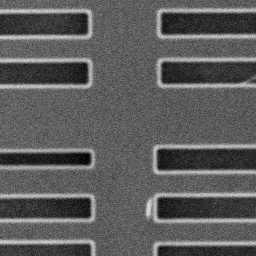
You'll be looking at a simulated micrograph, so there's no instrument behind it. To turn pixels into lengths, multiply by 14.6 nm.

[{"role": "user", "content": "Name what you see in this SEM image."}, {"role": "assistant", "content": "groups of lines, slits or small figures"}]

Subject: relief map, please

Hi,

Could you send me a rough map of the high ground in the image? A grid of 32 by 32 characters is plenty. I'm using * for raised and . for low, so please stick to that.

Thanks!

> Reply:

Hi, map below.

********************************
...........*********............
...........*********............
...........*********............
...........**********...........
********************************
********************************
***********************.........
...........*********............
...........*********............
...........*********..........*.
********************************
********************************
********************************
********************************
********************************
********************************
********************************
********************............
............*******.............
...........********.............
********************............
********************************
********************************
********************............
............*******.............
............*******.............
...........*********............
********************************
********************************
...........************.........
............*******.............